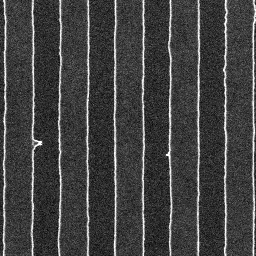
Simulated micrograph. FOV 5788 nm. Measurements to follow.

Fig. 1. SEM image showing parallel lines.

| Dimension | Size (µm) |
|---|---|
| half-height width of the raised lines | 0.659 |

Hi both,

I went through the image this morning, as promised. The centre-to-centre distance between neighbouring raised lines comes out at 1250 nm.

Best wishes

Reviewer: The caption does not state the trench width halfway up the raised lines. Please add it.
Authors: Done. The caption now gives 594 nm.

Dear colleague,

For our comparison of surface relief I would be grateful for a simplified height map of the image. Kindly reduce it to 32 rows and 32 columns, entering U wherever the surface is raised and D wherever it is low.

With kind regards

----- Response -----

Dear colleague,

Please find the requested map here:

DUUUDDDUUUUDDDUUUUDDDUUUUDDDUUUU
DUUUDDDDUUUDDDUUUUDDDUUUUDDDUUUU
DUUUDDDDUUUDDDUUUUDDDUUUUDDDUUUU
DUUUDDDDUUUDDDUUUUDDDUUUUDDDUUUU
DUUUDDDDUUUDDDUUUUDDDUUUUDDDUUUU
DUUUDDDUUUUDDDUUUUDDDUUUUDDDUUUU
DUUUDDDUUUUDDDUUUUDDDUUUUDDDUUUU
DUUUDDDDUUUDDDUUUUDDDUUUUDDDUUUU
DUUUDDDDUUUDDDUUUUDDDUUUUDDDUUUU
DUUUDDDUUUUDDDUUUUDDDUUUUDDDUUUU
DUUUDDDUUUUDDDUUUUDDDUUUUDDDUUUU
DUUUDDDUUUUDDDUUUUDDDUUUUDDDUUUU
DUUUDDDUUUUDDDUUUUDDDUUUUDDDUUUU
DUUUDDDUUUUDDDUUUUDDDUUUUDDDUUUU
DUUUDDDUUUUDDDUUUUDDDUUUUDDDUUUU
DUUUDDDUUUUDDDUUUUDDDUUUUDDDUUUU
DUUUDDDUUUUDDDUUUUDDDUUUUDDDUUUU
DUUUUDDUUUUDDDUUUUDDDUUUUDDDUUUU
DUUUDDDUUUUDDDUUUUDDDUUUUDDDUUUU
DUUUDDDUUUUDDDUUUUDDDUUUUDDDUUUU
UUUUDDDUUUUDDDUUUUDDDUUUUDDDUUUU
UUUUDDDUUUUDDDUUUUDDDUUUUDDDUUUU
DUUUDDDDUUUDDDUUUUDDDUUUUDDDUUUU
DUUUDDDDUUUDDDUUUUDDDUUUUDDDUUUU
UUUUDDDDUUUDDDUUUUDDDUUUUDDDUUUU
UUUUDDDUUUUDDDUUUUDDDUUUUDDDUUUU
UUUUDDDDUUUDDDUUUUDDDUUUUDDDUUUU
DUUUDDDUUUUDDDUUUUDDDUUUUDDDUUUU
UUUUDDDUUUUDDDUUUUDDDUUUUDDDUUUU
UUUUDDDUUUUDDDUUUUDDDUUUUDDDUUUU
UUUUDDDUUUUDDDUUUUDDDUUUUDDDUUUU
UUUUDDDUUUUDDDUUUUDDDUUUUDDDUUUU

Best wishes